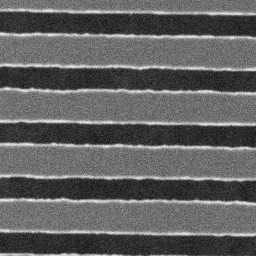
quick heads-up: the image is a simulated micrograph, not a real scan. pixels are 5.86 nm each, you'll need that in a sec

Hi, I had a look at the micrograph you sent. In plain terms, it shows lines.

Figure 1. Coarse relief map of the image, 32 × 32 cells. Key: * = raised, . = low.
********************************
........************************
................................
................................
*****************...............
********************************
********************************
********************************
................***.************
................................
................................
****************************....
********************************
********************************
********************************
.........................*******
................................
................................
*******************************.
********************************
********************************
********************************
............................***.
................................
................................
********************************
********************************
********************************
********************************
................................
................................
................................